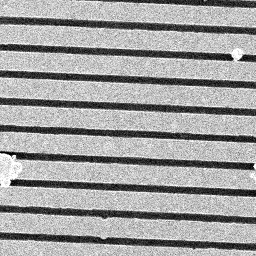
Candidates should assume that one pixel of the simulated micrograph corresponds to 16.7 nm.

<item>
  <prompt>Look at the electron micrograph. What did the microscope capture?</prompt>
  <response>parallel lines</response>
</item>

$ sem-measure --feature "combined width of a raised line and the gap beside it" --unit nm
451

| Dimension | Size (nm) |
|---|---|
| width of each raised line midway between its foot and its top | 334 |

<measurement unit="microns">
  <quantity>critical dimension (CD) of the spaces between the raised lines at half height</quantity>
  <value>0.111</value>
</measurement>